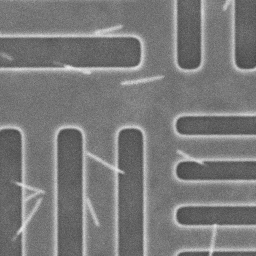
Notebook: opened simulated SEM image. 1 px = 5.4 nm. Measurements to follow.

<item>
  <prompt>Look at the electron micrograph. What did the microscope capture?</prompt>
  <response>groups of lines, slits or small figures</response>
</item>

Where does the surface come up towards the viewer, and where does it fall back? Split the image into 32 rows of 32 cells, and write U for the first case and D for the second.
UUUUUUUUUUUUUUUUUUUUUUDDDUUUUDDD
UUUUUUUUUUUUUUUUUUUUUUDDDUUUUDDD
UUUUUUUUUUUUUUUUUUUUUUDDDUUUUDDD
UUUUUUUUUUUUUUUUUUUUUUDDDUUUUDDD
UUUUUUUUUUUUUUUUUUUUUUDDDUUUUDDD
DDDDDDDDDDDDDDDDDDUUUUDDDUUUUDDD
DDDDDDDDDDDDDDDDDDUUUUDDDUUUUDDD
DDDDDDDDDDDDDDDDDDUUUUDDDUUUUDDD
DDDDDDDDUUDDDDDDDUUUUUUDDUUUUUDD
UUUUUUUUUUUUUUUUUUUUUUUUUUUUUUUU
UUUUUUUUUUUUUUUUUUUUUUUUUUUUUUUU
UUUUUUUUUUUUUUUUUUUUUUUUUUUUUUUU
UUUUUUUUUUUUUUUUUUUUUUUUUUUUUUUU
UUUUUUUUUUUUUUUUUUUUUUUUUUUUUUUU
UUUUUUUUUUUUUUUUUUUUUUUDDDDDDDDD
UUUUUUUUUUUUUUUUUUUUUUDDDDDDDDDD
DDDUUUUDDDUUUUUDDDUUUUDDDDDDDDDD
DDDUUUUDDDUUUUUDDDUUUUUUUUUUUUUU
DDDUUUUDDDUUUUUDDDUUUUUUUUUUUUUU
DDDUUUUDDDUUUUUDDDUUUUUUUUUUUUUU
DDDUUUUDDDUUUUUDDDUUUUDDDDDDDDDD
DDDUUUUDDDUUUUUDDDUUUUDDDDDDDDDD
DDDUUUUDDDUUUUUDDDUUUUUDDDDDDDDD
DDDUUUUDDDUUUUUDDDUUUUUUUUUUUUUU
DDDUUUUDDDUUUUUDDDUUUUUUUUUUUUUU
DDDUUUUDDDUUUUUDDDUUUUUUUUUUUUUU
DDDUUUUDDDUUUUUDDDUUUUDDDDDDDDDD
DDDUUUUDDDUUUUUDDDUUUUDDDDDDDDDD
DDDUUUUDDDUUUUUDDDUUUUUUUUUUUUUU
DDDUUUUDDDUUUUUDDDUUUUUUUUUUUUUU
DDDUUUUDDDUUUUUDDDUUUUUUUUUUUUUU
DDDUUUUDDDUUUUUDDDUUUUUDDDDDDDDD